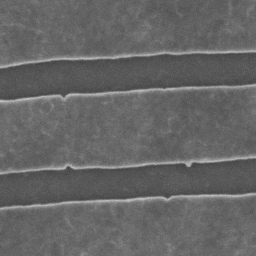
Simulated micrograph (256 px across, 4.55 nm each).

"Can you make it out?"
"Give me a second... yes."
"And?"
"one or a few lines or trenches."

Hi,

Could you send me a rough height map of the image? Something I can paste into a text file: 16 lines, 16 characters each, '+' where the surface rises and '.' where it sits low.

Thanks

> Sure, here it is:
++++++++++++++++
++++++++++++++++
++++++++++++++++
++++++++........
................
...........+++++
++++++++++++++++
++++++++++++++++
++++++++++++++++
++++++++++++++++
++++............
................
........++++++++
++++++++++++++++
++++++++++++++++
++++++++++++++++